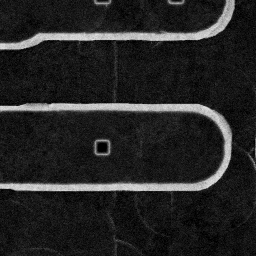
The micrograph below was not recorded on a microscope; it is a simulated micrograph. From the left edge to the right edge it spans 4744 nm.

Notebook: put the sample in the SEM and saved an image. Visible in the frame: wiring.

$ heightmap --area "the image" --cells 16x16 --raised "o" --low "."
oooooooooooooo..
oooooooooooooo..
oo..............
................
................
................
................
oooooooooooooo..
oooooooooooooo..
oooooooooooooo..
oooooooooooooo..
ooooooooooooo...
................
................
................
................